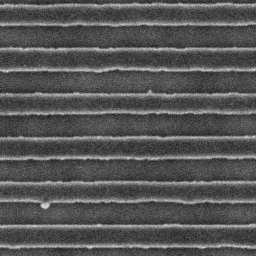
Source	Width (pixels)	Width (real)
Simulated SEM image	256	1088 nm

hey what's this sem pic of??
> lines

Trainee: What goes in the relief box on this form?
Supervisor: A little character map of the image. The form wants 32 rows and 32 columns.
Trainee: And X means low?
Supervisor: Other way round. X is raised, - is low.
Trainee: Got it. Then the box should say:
-----------------X-XX-X----XX---
XXXXXXXXXXXXXXXXXXXXXXXXXXXXXXXX
XXXXXXXXXXXXXXXXXXXXXXXXXXXXXXXX
--------------------------------
--------------------------------
--------------------------------
XXXXXXXXXXXXXXXXXXXXXXXXXXXXXXXX
XXXXXXXXXXXXXXXXXXXXXXXXXXXXXXXX
XXXXXXXXXXXXXXXXXXXXXXXXXXXXXXXX
--------------------------------
--------------------------------
--------------------------------
XXXXXXXXXXXXXXXXXXXXXXXXXXXXXXXX
XXXXXXXXXXXXXXXXXXXXXXXXXXXXXXXX
--------------------------------
--------------------------------
--------------------------------
XXXXXXXXXXXXXXXXXXXXXXXXXXXXXXXX
XXXXXXXXXXXXXXXXXXXXXXXXXXXXXXXX
XXXXXXXXXXXXXXXXXXXXXXXXXXXXXXXX
--------------------------------
--------------------------------
--------------------------------
XXXXXXXXXXXXXXXXXXXXXXXXXXXXXXXX
XXXXXXXXXXXXXXXXXXXXXXXXXXXXXXXX
-----X--------------------------
--------------------------------
--------------------------------
XXXXXXXXXXXXXXXXXXXXXXXXXXXXXXXX
XXXXXXXXXXXXXXXXXXXXXXXXXXXXXXXX
XXXXXXXXXXXXXXXXXXXXXXXXXXXXXXXX
--------------------------------